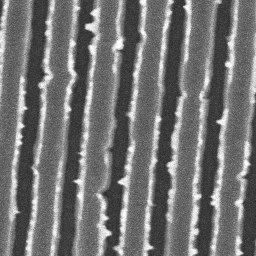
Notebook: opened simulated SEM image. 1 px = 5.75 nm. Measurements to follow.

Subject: parallel lines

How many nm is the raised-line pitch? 262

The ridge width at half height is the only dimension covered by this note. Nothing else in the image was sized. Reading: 163 nm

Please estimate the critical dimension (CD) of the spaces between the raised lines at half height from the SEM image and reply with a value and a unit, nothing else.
101 nanometers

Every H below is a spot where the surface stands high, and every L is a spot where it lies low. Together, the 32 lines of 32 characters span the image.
LHHHLLHHHHLLHHHLLLHHHLLHHHHLLHHH
HHHHLLHHHHLLHHHLLLHHHLLHHHHLLHHH
HHHHLLHHHHLLHHHLLLHHHLLHHHHLLHHH
HHHHLLHHHLLHHHHLLLHHHLLHHHHLLHHH
HHHHLLHHHLLLHHHLLLHHHLLHHHHLLHHH
HHHHLLHHHLLHHHHLLLHHHLLHHHHLLHHH
HHHLLLHHHLLHHHHLLHHHHLLHHHLLLHHH
HHHLLLHHHLLHHHHLLHHHLLLHHHLLLHHH
HHHLLLHHHLLHHHHLLHHHLLLHHHLLHHHH
HHHLLLHHHHLHHHHLLHHHLLLHHHLLLHHH
HHHLLHHHHLLHHHHLLHHHLLLHHHLLHHHH
HHHLLHHHHLLHHHLLLHHHLLLHHHLLHHHH
HHHLLHHHHLLHHHLLHHHHLLHHHHLLHHHH
HHHLLHHHHLLHHHLLHHHHLLHHHHLLHHHH
HHHLLHHHLLLHHHLLHHHHLLHHHHLLHHHL
HHHLLHHHLLLHHHLLHHHHLLHHHLLHHHHL
HHHLLHHHLLLHHHLLHHHHLLHHHLLLHHHL
HHHLLHHHLLHHHHLLHHHHLHHHHLLHHHHL
HHLLLHHHLLHHHHLLHHHHLLHHHLLHHHHL
HHLLHHHHLLHHHHLLHHHLLLHHHLLHHHHL
HHLLHHHHLLHHHHLLHHHLLHHHHLLHHHHL
HHLLHHHHLLHHHHLLHHHLLHHHHLLHHHHL
HHLLHHHHLLHHHLLHHHHLLLHHHLLHHHHL
HHLLHHHLLLHHHLLLHHHLLHHHHLLHHHHL
HHLLHHHLLLHHHLLHHHHLLHHHHLLHHHLL
HHLLHHHLLLHHHLLHHHHLLHHHHLLHHHLL
HHLLHHHLLLHHHLLHHHHLLHHHHLLHHHLL
HHLLHHHLLLHHHLLHHHHLLHHHHLLHHHLL
HHLLHHHLLLHHHLLHHHHLLHHHHLLHHHLL
HLLLHHHLLLHHHHLHHHHLLHHHHLLHHHLL
HLLHHHHLLHHHHLLHHHHLLHHHLLHHHHLL
HLLHHHHLLHHHHLLHHHHLLHHHLLHHHHLL